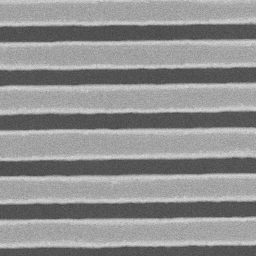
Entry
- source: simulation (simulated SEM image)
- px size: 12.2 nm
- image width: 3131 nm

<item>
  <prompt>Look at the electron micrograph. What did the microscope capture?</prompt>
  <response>lines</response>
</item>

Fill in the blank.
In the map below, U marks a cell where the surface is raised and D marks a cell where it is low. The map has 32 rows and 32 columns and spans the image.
UUUUUUUUUUUUUUUUUUUUUUUUUUUUUUUU
UUUUUUUUUUUUUUUUUUUUUUUUUUUUUUUU
UUUUUUUUUUUUUUUUUUUUUUUUUUUUUUUU
DDDDDDDDDDDDDDDDDDDDDDDDDDDDDDDD
DDDDDDDDDDDDDDDDDDDDDDDDDDDDDDDD
UUUUUUUUUUUUUUUUUUUUUUUUUUUUUUUU
UUUUUUUUUUUUUUUUUUUUUUUUUUUUUUUU
UUUUUUUUUUUUUUUUUUUUUUUUUUUUUUUU
UUUUUUUUUUUUUUUUUDUUDDDDDDDDDDDD
DDDDDDDDDDDDDDDDDDDDDDDDDDDDDDDD
DDDDDDDDDDDDDDDDDDDDDUUUUUUUUUUU
UUUUUUUUUUUUUUUUUUUUUUUUUUUUUUUU
UUUUUUUUUUUUUUUUUUUUUUUUUUUUUUUU
UUUUUUUUUUUUUUUUUUUUUUUUUUUUUUUU
DDDDDDDDDDDDDDDDDDDDDDDDDDDDDDDD
DDDDDDDDDDDDDDDDDDDDDDDDDDDDDDDD
UUUUUUUUUUUUUUUUUUUUUUUUUUUUUUUU
UUUUUUUUUUUUUUUUUUUUUUUUUUUUUUUU
UUUUUUUUUUUUUUUUUUUUUUUUUUUUUUUU
UUUUUUUUUUUUUUUUUUUUUUUUUUUUUUUU
DDDDDDDDDDDDDDDDDDDDDDDDDDDDDDDD
DDDDDDDDDDDDDDDDDDDDDDDDDDDDDDDD
UUUUUUUUUUUUUUUUUUUUUUUUUUUUUUUU
UUUUUUUUUUUUUUUUUUUUUUUUUUUUUUUU
UUUUUUUUUUUUUUUUUUUUUUUUUUUUUUUU
DDDDDDDDDDDDDDDDDDDDDDDDDDDDDDDD
DDDDDDDDDDDDDDDDDDDDDDDDDDDDDDDD
UUUUUUUUUUUUUUUUUUUUUUUUUUUUUUUU
UUUUUUUUUUUUUUUUUUUUUUUUUUUUUUUU
UUUUUUUUUUUUUUUUUUUUUUUUUUUUUUUU
UUUUUUUUUUUUUUUUUUUUUUUUUUUUUUUU
DDDDDDDDDDDDDDDDDDDDDDDDDDDDDDDD